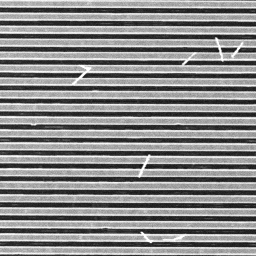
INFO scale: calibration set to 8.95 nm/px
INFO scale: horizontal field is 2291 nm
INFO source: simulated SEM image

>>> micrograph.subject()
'parallel lines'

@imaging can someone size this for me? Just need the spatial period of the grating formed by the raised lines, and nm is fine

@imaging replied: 116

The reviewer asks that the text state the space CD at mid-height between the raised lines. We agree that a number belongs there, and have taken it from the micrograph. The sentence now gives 50.3 nm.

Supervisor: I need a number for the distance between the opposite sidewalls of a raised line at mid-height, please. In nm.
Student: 66